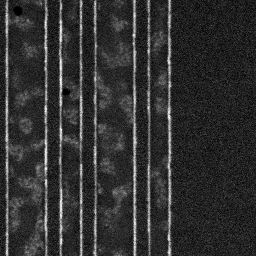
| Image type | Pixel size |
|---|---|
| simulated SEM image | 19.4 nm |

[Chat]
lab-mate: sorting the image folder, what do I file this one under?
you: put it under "parallel lines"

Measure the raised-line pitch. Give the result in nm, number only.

857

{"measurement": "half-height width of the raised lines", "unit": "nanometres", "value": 296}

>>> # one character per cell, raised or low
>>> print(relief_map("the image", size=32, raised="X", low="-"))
X-----XX--XX-----XX--XXXXXXXXXXX
X-----XX--XX-----XX--XXXXXXXXXXX
X-----XX--XX-----XX--XXXXXXXXXXX
X-----XX--XX-----XX--XXXXXXXXXXX
X-----XX--XX-----XX--XXXXXXXXXXX
X-----XX--XX-----XX--XXXXXXXXXXX
X-----XX--XX-----XX--XXXXXXXXXXX
X-----XX--XX-----XX--XXXXXXXXXXX
X-----XX--XX-----XX--XXXXXXXXXXX
X-----XX--XX-----XX--XXXXXXXXXXX
X-----XX--XX-----XX--XXXXXXXXXXX
X-----XX--XX-----XX--XXXXXXXXXXX
X-----XX--XX-----XX--XXXXXXXXXXX
X-----XX--XX-----XX--XXXXXXXXXXX
X-----XX--XX-----XX--XXXXXXXXXXX
X-----XX--XX-----XX--XXXXXXXXXXX
X-----XX--XX-----XX--XXXXXXXXXXX
X-----XX--XX-----XX--XXXXXXXXXXX
X-----XX--XX-----XX--XXXXXXXXXXX
X-----XX--XX-----XX--XXXXXXXXXXX
X-----XX--XX-----XX--XXXXXXXXXXX
X-----XX--XX-----XX--XXXXXXXXXXX
X-----XX--XX-----XX--XXXXXXXXXXX
X-----XX--XX-----XX--XXXXXXXXXXX
X-----XX--XX-----XX--XXXXXXXXXXX
X-----XX--XX-----XX--XXXXXXXXXXX
X-----XX--XX-----XX--XXXXXXXXXXX
X-----XX--XX-----XX--XXXXXXXXXXX
X-----XX--XX-----XX--XXXXXXXXXXX
X-----XX--XX-----XX--XXXXXXXXXXX
X-----XX--XX-----XX--XXXXXXXXXXX
X-----XX--XX-----XX--XXXXXXXXXXX